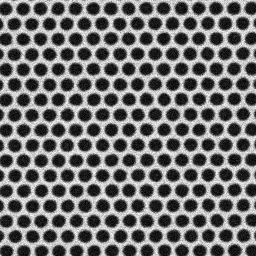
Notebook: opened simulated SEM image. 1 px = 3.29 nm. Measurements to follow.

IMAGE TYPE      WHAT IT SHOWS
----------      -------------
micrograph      a regular array of holes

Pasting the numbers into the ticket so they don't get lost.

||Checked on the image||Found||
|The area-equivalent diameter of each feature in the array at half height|41.6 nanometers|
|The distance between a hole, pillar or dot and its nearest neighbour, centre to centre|0.0567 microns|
